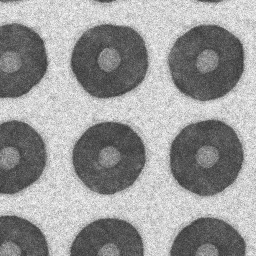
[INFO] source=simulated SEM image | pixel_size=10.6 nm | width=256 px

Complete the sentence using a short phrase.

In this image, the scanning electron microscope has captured ring-shaped grooves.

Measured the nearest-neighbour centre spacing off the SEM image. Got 1020 nm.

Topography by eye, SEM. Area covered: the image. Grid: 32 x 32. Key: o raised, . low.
oooooooooooooooooooooooooooooooo
oooooooooooooooooooooooooooooooo
oooooooooooooooooooooooooooooooo
....ooooooo......ooooooo....oooo
.....ooooo........ooooo......ooo
......ooo.........oooo........oo
......ooo....oo...ooo....oo...oo
oo....ooo...ooo....oo....oo....o
oo....ooo....o.....oo....oo....o
.....oooo.........ooo.........oo
.....ooooo........oooo........oo
....ooooooo.....ooooooo......ooo
oooooooooooooooooooooooo...ooooo
oooooooooooooooooooooooooooooooo
oooooooooooooooooooooooooooooooo
...ooooooooo...ooooooooo....oooo
.....oooooo......ooooo.......ooo
.....ooooo........oooo........oo
.o....ooo....o....ooo....oo...oo
oo....ooo...ooo...ooo....oo....o
oo....ooo....o....ooo....oo...oo
.....oooo.........ooo.........oo
.....ooooo.......ooooo.......ooo
...oooooooo.....ooooooo.....oooo
ooooooooooooooooooooooooo.oooooo
oooooooooooooooooooooooooooooooo
oooooooooooooooooooooooooooooooo
...ooooooooo...ooooooooo....oooo
.....ooooo.......oooooo......ooo
......oooo........oooo........oo
oo....ooo....o....oooo.........o
ooo...ooo...ooo...ooo....oo....o